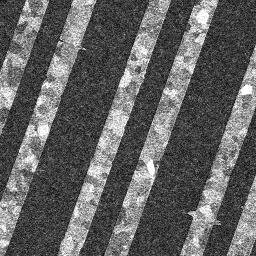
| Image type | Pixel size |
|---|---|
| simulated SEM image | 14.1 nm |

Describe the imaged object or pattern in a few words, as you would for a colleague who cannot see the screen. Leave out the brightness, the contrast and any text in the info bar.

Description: parallel lines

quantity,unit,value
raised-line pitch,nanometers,827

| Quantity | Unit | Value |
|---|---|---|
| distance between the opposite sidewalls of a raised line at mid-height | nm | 279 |